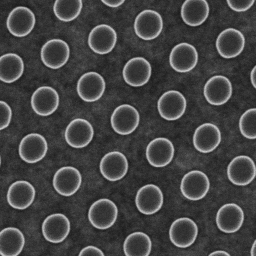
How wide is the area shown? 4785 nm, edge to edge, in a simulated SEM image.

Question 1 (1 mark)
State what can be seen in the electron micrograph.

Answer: a regular array of raised bodies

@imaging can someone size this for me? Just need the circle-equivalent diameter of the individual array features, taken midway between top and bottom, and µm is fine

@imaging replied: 0.516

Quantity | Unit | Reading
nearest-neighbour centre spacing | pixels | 47.6